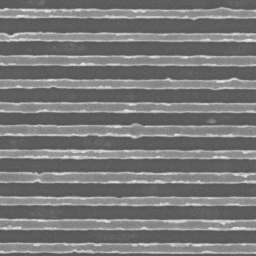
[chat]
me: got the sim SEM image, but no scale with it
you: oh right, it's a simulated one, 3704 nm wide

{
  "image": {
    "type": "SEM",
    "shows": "parallel lines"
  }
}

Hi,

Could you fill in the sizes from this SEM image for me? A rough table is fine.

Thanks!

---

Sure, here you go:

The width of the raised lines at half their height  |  127 nanometers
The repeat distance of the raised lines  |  339 nm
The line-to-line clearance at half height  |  210 nm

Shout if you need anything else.